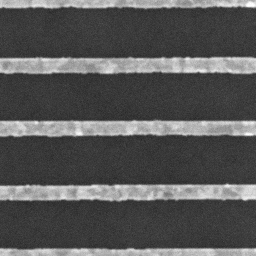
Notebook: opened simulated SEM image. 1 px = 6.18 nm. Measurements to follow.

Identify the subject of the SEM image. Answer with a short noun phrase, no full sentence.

lines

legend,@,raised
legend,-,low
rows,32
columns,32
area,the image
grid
@@@@@@@@@@@@@@@@@@@@@@@@@@@@@@@@
--------------------------------
--------------------------------
--------------------------------
--------------------------------
--------------------------------
--------------------------------
@@@@@@@@@@@@@@@@@@@@@@@@@@@@@@@@
@@@@@@@@@@@@@@@@@@@@@@@@@@@@@@@@
--------------------------------
--------------------------------
--------------------------------
--------------------------------
--------------------------------
--------------------------------
@@@@@@@@@@@@@@@@@@@@@@@@@@@@@@@@
@@@@@@@@@@@@@@@@@@@@@@@@@@@@@@@@
--------------------------------
--------------------------------
--------------------------------
--------------------------------
--------------------------------
--------------------------------
@@@@@@@@@@@@@@@@@@@@@@@@@@@@@@@@
@@@@@@@@@@@@@@@@@@@@@@@@@@@@@@@@
--------------------------------
--------------------------------
--------------------------------
--------------------------------
--------------------------------
--------------------------------
@@@@@@@@@@@@@@@@@@@@@@@@@@@@@@@@